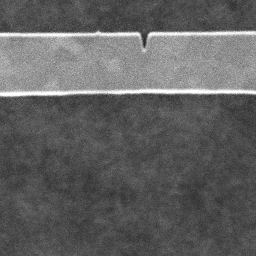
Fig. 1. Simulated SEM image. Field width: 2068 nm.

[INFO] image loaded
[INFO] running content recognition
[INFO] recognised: one or a few lines or trenches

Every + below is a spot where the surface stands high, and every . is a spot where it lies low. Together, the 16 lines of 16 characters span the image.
................
................
++++++++++++++++
++++++++++++++++
++++++++++++++++
++++++++++++++++
................
................
................
................
................
................
................
................
................
................